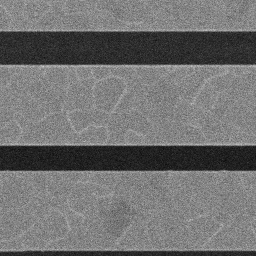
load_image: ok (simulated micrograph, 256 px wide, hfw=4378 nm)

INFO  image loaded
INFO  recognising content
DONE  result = lines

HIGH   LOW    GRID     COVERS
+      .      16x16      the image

++++++++++++++++
++++++++++++++++
................
................
++++++++++++++++
++++++++++++++++
++++++++++++++++
++++++++++++++++
++++++++++++++++
................
................
++++++++++++++++
++++++++++++++++
++++++++++++++++
++++++++++++++++
++++++++++++++++